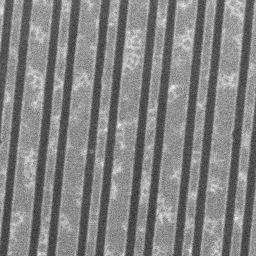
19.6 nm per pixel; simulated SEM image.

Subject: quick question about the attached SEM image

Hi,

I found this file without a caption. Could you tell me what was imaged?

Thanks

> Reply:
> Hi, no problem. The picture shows parallel lines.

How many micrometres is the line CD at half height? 0.195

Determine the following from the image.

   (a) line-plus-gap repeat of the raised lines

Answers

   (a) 24.3 pixels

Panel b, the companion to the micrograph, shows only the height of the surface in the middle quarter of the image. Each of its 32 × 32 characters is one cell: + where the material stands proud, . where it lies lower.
+++.....++..+++.....++..+++.....
+++.....++..+++.....++..+++.....
++......++..++.....+++..+++.....
++.....+++..++.....+++..+++....+
++.....++...++.....+++..++.....+
++.....+++..++.....+++..++.....+
++.....++...++.....++...++.....+
++.....++...++.....++...++.....+
++.....++...++.....++..+++.....+
++.....++..+++.....++..+++.....+
++.....++..+++.....++..+++.....+
++.....++..+++.....++..+++.....+
++.....++..+++.....++..+++.....+
+.....+++..++.....+++..+++....++
+.....+++..++.....+++..++.....++
+.....+++..++.....+++..++.....++
+.....++...++.....+++..++.....++
+.....++...++.....++...++.....++
+.....++...++.....++...++.....++
+.....++..+++.....++...++.....++
+.....++..+++.....++..+++.....++
+.....++..+++.....++..+++.....++
.....+++..+++.....++..+++.....++
.....+++..+++....+++..+++....+++
.....+++..+++....+++..++.....+++
.....+++..++.....+++..++.....+++
.....+++..++.....+++..++.....+++
.....+++..++.....+++..++.....+++
.....+++..++.....++...++.....+++
.....++..+++.....++...++.....++.
.....++..+++.....++..+++.....++.
.....++..+++.....+++++++.....++.